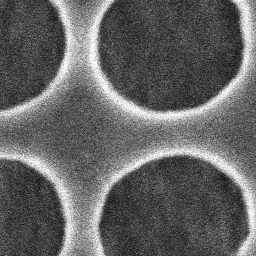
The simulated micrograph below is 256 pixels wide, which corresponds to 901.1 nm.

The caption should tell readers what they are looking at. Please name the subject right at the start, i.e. holes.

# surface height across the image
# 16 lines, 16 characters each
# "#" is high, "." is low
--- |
....###........#
....##.........#
....##.........#
....##.........#
....##.........#
...####.......##
..######.....###
################
################
################
..######......##
....###........#
....###........#
....##..........
....##..........
....##.........#